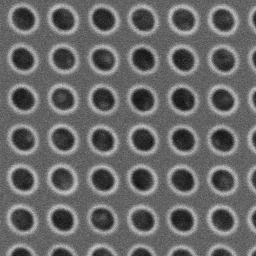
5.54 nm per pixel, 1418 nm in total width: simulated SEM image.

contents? a regular array of holes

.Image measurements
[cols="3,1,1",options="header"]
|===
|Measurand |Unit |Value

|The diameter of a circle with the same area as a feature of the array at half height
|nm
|137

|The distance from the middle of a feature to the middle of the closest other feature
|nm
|219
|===